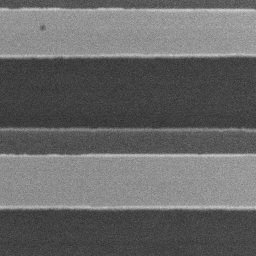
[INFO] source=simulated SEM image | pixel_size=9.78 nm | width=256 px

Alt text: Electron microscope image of lines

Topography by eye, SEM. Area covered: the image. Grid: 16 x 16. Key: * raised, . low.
****************
****************
****************
******...*......
................
................
................
................
****************
****************
****************
****************
****************
................
................
................